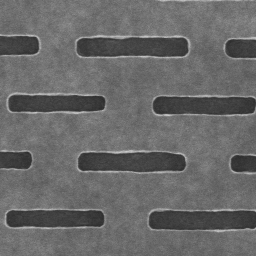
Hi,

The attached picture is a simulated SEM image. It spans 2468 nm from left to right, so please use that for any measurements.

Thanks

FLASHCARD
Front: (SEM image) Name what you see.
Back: holes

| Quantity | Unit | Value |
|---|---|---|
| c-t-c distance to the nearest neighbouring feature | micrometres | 0.923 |